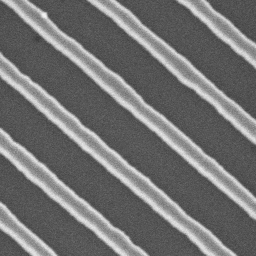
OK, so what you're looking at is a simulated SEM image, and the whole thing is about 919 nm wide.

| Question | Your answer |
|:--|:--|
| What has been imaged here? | lines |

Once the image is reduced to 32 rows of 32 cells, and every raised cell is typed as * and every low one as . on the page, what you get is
.***........***........***......
..***........***........***.....
...***........***........***....
....***........***........****..
.....***........****.......****.
......****........***........***
........***........***........**
*........***........***........*
**........***........***........
***........****.......***.......
.***........****.......****.....
...***.......****........***....
....***........***........***...
.....***........***........***..
......***........***........***.
.......***........****.......***
*.......****.......****.......**
**.......****........***.......*
***.......****........***.......
.***........***........***......
..***........***........***.....
...***........***........***....
....***........****.......****..
.....****.......****.......****.
......****.......****........***
........***........***........**
*........***........***........*
**........***........***........
***........***........****......
.****.......****.......****.....
..****.......****........***....
....***........***.......****...